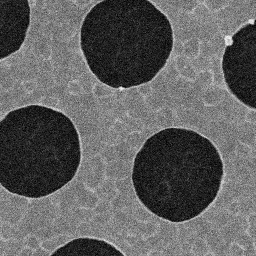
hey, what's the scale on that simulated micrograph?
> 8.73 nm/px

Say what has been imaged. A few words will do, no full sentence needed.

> holes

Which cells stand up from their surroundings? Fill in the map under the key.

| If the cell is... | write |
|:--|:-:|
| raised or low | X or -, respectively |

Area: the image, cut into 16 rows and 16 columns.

--XXXX----XXXXXX
--XXX------XXXXX
--XXX------XXXX-
XXXXX------XXX--
XXXXXX----XXXX--
XXXXXXXXXXXXXX--
XXXXXXXXXXXXXXX-
----XXXXXXXXXXXX
-----XXXXX---XXX
-----XXXX-----XX
-----XXX------XX
----XXXX------XX
XXXXXXXXX----XXX
XXXXXXXXXX--XXXX
XXXXXXXXXXXXXXXX
XXXX---XXXXXXXXX